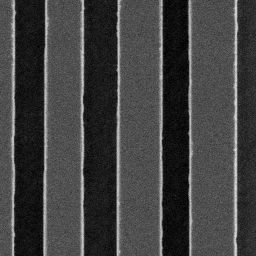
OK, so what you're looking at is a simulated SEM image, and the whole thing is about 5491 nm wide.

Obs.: lines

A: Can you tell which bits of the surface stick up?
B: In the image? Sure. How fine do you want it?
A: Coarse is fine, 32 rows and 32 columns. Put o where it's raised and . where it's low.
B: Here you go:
oo....oooo.....ooooo....oooooo..
oo....oooo.....ooooo....oooooo..
oo....oooo.....ooooo....oooooo..
oo....oooo.....ooooo....oooooo..
oo....oooo.....ooooo....oooooo..
oo....oooo.....ooooo....oooooo..
oo....oooo.....ooooo....oooooo..
oo....oooo.....ooooo....oooooo..
oo....oooo.....ooooo....oooooo..
oo....oooo.....ooooo....oooooo..
oo....oooo.....ooooo....oooooo..
oo....oooo.....ooooo....oooooo..
oo....oooo.....ooooo....oooooo..
oo....oooo.....ooooo....oooooo..
oo....oooo.....ooooo....oooooo..
oo....oooo.....ooooo....oooooo..
oo....oooo.....ooooo....oooooo..
oo....oooo.....ooooo....oooooo..
oo....oooo.....ooooo....oooooo..
oo....oooo.....ooooo....oooooo..
oo....oooo.....ooooo....oooooo..
oo....oooo.....ooooo....oooooo..
oo....oooo.....ooooo....oooooo..
oo...ooooo.....ooooo....oooooo..
oo...ooooo.....ooooo....oooooo..
oo...ooooo.....ooooo....oooooo..
oo...ooooo.....ooooo....oooooo..
oo...ooooo.....ooooo....oooooo..
oo...ooooo.....ooooo....oooooo..
oo...ooooo.....ooooo....oooooo..
oo...ooooo.....ooooo....oooooo..
oo...ooooo.....ooooo....oooooo..